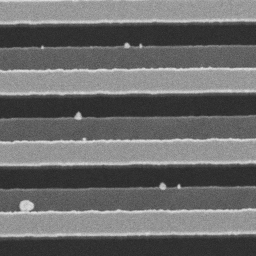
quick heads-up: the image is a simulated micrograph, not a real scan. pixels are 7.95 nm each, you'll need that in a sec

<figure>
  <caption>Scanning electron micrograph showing lines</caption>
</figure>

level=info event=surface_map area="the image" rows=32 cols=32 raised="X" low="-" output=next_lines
XXXXXXXXXXXXXXXXXXXXXXXXXXXXXXXX
XXXXXXXXXXXXXXXXXXXXXXXXXXXXXXXX
XXXXXXXXXXXXXXXXXXXXXXXXXXXXXXXX
--------------------------------
--------------------------------
--------------------------------
XXXXXXXXXXXXXXXXXXXXXXXXXXXXXXXX
XXXXXXXXXXXXXXXXXXXXXXXXXXXXXXXX
XXXXXXXXXXXXXXXXXXXXXXXXXXXXXXXX
XXXXXXXXXXXXXXXXXXXXXXXXXXXXXXXX
XXXXXXXXXXXXXXXXXXXXXXXXXXXXXXXX
XXXXXXXXXXXXXXXXXXXXXXXXXXXXXXXX
--------------------------------
--------------------------------
---------X---------------------X
XXXXXXXXXXXXXXXXXXXXXXXXXXXXXXXX
XXXXXXXXXXXXXXXXXXXXXXXXXXXXXXXX
XXXXXXXXXXXXXXXXXXXXXXXXXXXXXXXX
XXXXXXXXXXXXXXXXXXXXXXXXXXXXXXXX
XXXXXXXXXXXXXXXXXXXXXXXXXXXXXXXX
XXXXXXXXXXXXXXXXXXXXXX----------
--------------------------------
--------------------------------
-----------------XXXXXXXXXXXXXXX
XXXXXXXXXXXXXXXXXXXXXXXXXXXXXXXX
XXXXXXXXXXXXXXXXXXXXXXXXXXXXXXXX
XXXXXXXXXXXXXXXXXXXXXXXXXXXXXXXX
XXXXXXXXXXXXXXXXXXXXXXXXXXXXXXXX
XXXXXXXXXXXXXXXXXXXXXXXXXXXXXXXX
XXXXXXXXXXX---------------------
--------------------------------
--------------------------------